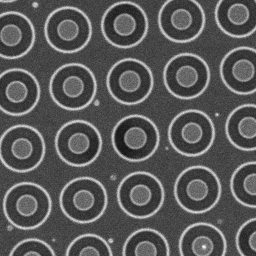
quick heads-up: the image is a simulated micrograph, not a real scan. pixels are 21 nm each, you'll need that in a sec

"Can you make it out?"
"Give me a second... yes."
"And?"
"an array of small figures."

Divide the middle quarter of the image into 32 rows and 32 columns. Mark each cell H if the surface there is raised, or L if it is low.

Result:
HLLLHHHHHHHHHLLLLLLLHHHHHHLLLLLL
LLLLLLHHHHHHLLLLLLLLLHHHHLLLLHHH
LLLLLLLHHHHLLLLHHHLLLHHHHLLLHHHH
LHHHLLLHHHHLLLHHHHHLLLHHHLLLHHHH
HHHHLLLLHHHLLLHHHHHLLLHHHLLLLHHH
HHHHHLLLHHHLLLHHHHHLLLHHHHLLLLHL
HHHHHLLLHHHLLLLHHHLLLLHHHHLLLLLL
LHHHLLLHHHHHLLLLLLLLLHHHHHHHLLLL
LLLLLLLHHHHHHLLLLLLLHHHHHHHHHHHH
LLLLLLHHHHHHHHHLLLHHHHHHHHHHHHHH
LLLLLHHHHHHHHHHHHHHHHHHHHHHHHHHH
HHHHHHHHHHHHHHHHHHHHHHHHHHHHHHHH
HHHHHHHHHHHHHHHHHHHHHHHHHHHHHHLL
HHHHHHHHHHHHHHHHLLLLHHHHHHHHLLLL
HHHLHHHHHHHHHHLLLLLLLLHHHHHLLLLL
LLLLLLLHHHHHHLLLLLLLLLHHHHHLLLHH
LLLLLLLLHHHHHLLLHHHHLLLHHHHLLLHH
LLLHLLLLHHHHLLLHHHHHLLLHHHHLLLHH
LLHHHHLLLHHHLLLHHHHHLLLHHHHLLLHH
LHHHHHLLLHHHLLLHHHHHLLLHHHHLLLLH
LHHHHHLLLHHHHLLLHHHHLLLHHHHHLLLL
LLHHHHLLLHHHHLLLLLLLLLHHHHHHHLLL
LLLLLLLLHHHHHHLLLLLLLLHHHHHHHHHL
LLLLLLLHHHHHHHHHLLLLHHHHHHHHHHHH
HLLLLLHHHHHHHHHHHHHHHHHHHHHHHHHH
HHHHHHHHHHHHHHHHHHHHHHHHHHHHHHHH
HHHHHHHHHHHHHHHHHHHHHHHHHHHHHHHL
HHHHHHHHHHHHHHHHHHLLHHHHHHHHHHLL
HHHHHHHHHHHHHHHHLLLLLLHHHHHHHLLL
HHLLLLLLHHHHHHHLLLLLLLLHHHHHLLLL
HLLLLLLLLHHHHHLLLLHHLLLLHHHHLLLH
LLLLLLLLLLHHHHLLLHHHHLLLHHHHLLLH